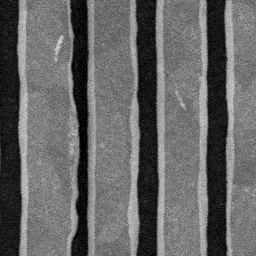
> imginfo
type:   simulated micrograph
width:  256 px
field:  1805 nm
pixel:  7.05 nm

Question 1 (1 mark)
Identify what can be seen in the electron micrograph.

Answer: one or a few lines or trenches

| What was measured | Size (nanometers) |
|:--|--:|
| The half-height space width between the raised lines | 183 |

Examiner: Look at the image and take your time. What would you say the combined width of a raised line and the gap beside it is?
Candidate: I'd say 470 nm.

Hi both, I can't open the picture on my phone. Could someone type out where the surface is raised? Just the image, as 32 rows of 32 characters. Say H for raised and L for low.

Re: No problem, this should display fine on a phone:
LLLHHHHHHLLHHHHHLLLLHHHHHLLLLHHH
LLLHHHHHHLLHHHHHLLLLHHHHHLLLLHHH
LLLHHHHHHLLHHHHHLLLLHHHHHLLLLHHH
LLLHHHHHHLLHHHHHLLLLHHHHHLLLLHHH
LLLHHHHHHLLHHHHHLLLLHHHHHLLLLHHH
LLLHHHHHHLLHHHHHLLLLHHHHHLLLLHHH
LLLHHHHHHLLHHHHHHLLLHHHHHHLLLHHH
LLLHHHHHHLLLHHHHHLLLHHHHHHLLLHHH
LLLHHHHHHLLLHHHHHLLLHHHHHHLLLHHH
LLLHHHHHHLLHHHHHHLLLHHHHHLLLLHHH
LLLHHHHHHLLHHHHHHLLLHHHHHLLLLHHH
LLLHHHHHHLLHHHHHHLLLHHHHHLLLLHHH
LLLHHHHHHLLHHHHHHLLLHHHHHLLLLHHH
LLLHHHHHHLLHHHHHHLLLHHHHHLLLLHHH
LLLHHHHHHLLLHHHHHLLLHHHHHLLLLHHH
LLLHHHHHHHLLHHHHHLLLHHHHHLLLLHHH
LLLHHHHHHHLHHHHHHLLLHHHHHLLLLHHH
LLLHHHHHHHLHHHHHHLLLHHHHHLLLLHHH
LLLHHHHHHHLLHHHHHLLLHHHHHLLLLHHH
LLLHHHHHHHLLHHHHHLLLHHHHHLLLLHHH
LLLHHHHHHLLLHHHHHLLLHHHHHLLLLHHH
LLLHHHHHHLLLHHHHHLLLHHHHHLLLLHHH
LLLHHHHHHLLLHHHHHLLLHHHHHLLLLHHH
LLLHHHHHHLLLHHHHHLLLHHHHHLLLLHHH
LLLHHHHHHLLLHHHHHLLLHHHHHLLLLHHH
LLLHHHHHHLLLHHHHHLLLHHHHHLLLLHHH
LLLHHHHHHLLHHHHHHLLLHHHHHLLLLHHH
LLLHHHHHHLLHHHHHHLLLHHHHHLLLLHHH
LLLHHHHHHLLHHHHHHLLLHHHHHLLLLHHH
LLLHHHHHHLLHHHHHHLLLHHHHHLLLLHHH
LLLHHHHHHLLHHHHHLLLLHHHHHLLLLHHH
LLLHHHHHHLLHHHHHLLLLHHHHHLLLLHHH